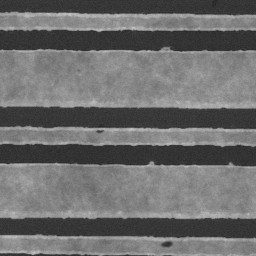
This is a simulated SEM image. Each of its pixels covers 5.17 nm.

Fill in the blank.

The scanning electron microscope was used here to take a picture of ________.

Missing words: lines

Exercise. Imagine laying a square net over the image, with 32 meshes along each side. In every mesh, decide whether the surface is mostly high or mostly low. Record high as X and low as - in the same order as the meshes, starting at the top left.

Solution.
--------------------------------
--------------------------------
XXXXXXXXXXXXXXXXXXXXXXXXXXXXXXXX
XXXXXXXXXXXXXXXXXXXXXXXXXXXXXXXX
--------------------------------
--------------------------------
XXXXXXXXXXXXXXXXXXXXXXXXXXXXXXXX
XXXXXXXXXXXXXXXXXXXXXXXXXXXXXXXX
XXXXXXXXXXXXXXXXXXXXXXXXXXXXXXXX
XXXXXXXXXXXXXXXXXXXXXXXXXXXXXXXX
XXXXXXXXXXXXXXXXXXXXXXXXXXXXXXXX
XXXXXXXXXXXXXXXXXXXXXXXXXXXXXXXX
XXXXXXXXXXXXXXXXXXXXXXXXXXXXXXXX
--------------------------------
--------------------------------
--------------------------------
XXXXXXXXXXXXXXXXXXXXXXXXXXXXXXXX
XXXXXXXXXXXXXXXXXXXXXXXXXXXXXXXX
--------------------------------
--------------------------------
--------------------------------
XXXXXXXXXXXXXXXXXXXXXXXXXXXXXXXX
XXXXXXXXXXXXXXXXXXXXXXXXXXXXXXXX
XXXXXXXXXXXXXXXXXXXXXXXXXXXXXXXX
XXXXXXXXXXXXXXXXXXXXXXXXXXXXXXXX
XXXXXXXXXXXXXXXXXXXXXXXXXXXXXXXX
XXXXXXXXXXXXXXXXXXXXXXXXXXXXXXXX
--------------------------------
--------------------------------
XXX-XX--------------------------
XXXXXXXXXXXXXXXXXXXXXXXXXXXXXXXX
XXXXXXXXXXXXXXXXXXXXXXXXXXXXXXXX